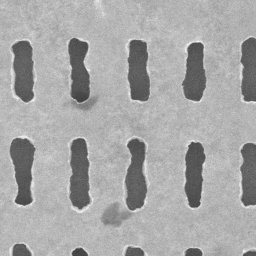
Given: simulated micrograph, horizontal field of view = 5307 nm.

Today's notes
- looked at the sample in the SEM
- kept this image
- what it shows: a regular array of holes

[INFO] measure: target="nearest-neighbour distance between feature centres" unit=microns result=1.17